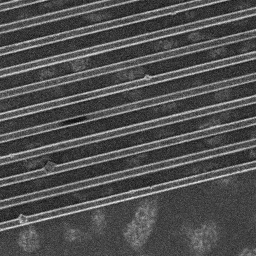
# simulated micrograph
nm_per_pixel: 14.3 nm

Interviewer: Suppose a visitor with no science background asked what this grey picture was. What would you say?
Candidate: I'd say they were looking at parallel lines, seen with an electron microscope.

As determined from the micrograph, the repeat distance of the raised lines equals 21.3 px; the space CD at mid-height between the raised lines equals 203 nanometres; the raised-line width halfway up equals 95.5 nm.